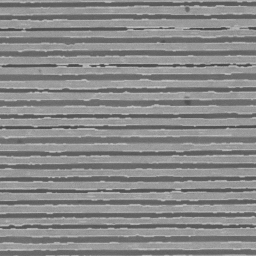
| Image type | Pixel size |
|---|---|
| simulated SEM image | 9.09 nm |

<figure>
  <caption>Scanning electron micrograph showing parallel lines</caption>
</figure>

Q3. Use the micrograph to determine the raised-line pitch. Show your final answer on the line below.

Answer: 113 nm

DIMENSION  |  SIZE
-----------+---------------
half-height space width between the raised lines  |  42.1 nm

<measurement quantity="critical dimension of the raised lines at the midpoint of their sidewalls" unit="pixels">8.38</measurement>